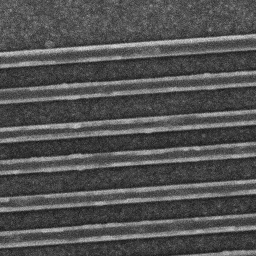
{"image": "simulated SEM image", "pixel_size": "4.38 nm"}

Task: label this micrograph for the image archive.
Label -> parallel lines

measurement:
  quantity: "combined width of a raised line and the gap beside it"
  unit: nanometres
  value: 157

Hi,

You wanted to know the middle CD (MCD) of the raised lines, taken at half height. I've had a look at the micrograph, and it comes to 64.9 nanometres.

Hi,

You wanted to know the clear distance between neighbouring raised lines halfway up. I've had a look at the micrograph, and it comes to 93.3 nm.